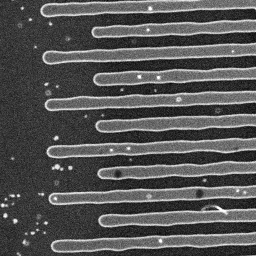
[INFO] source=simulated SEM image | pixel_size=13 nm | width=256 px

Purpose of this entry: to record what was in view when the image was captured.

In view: groups of lines, slits or small figures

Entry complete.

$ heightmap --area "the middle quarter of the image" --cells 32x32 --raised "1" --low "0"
00000000000000000000000000000000
00000000000000000000000000011110
00000000011111111111111111111111
00000001111111111111111111111111
00000000111111111111111111111110
00000000000000000000000000000000
00000000000000000000000000000000
00000000000000000000000000000111
00111111111111111111111111111111
11111111111111111111111111111111
11111111111111111111111111111100
00000000000000000000000000000000
00000000000000000000000000000000
00000000000000000000000000011111
00000000111111111111111111111111
00000000111111111111111111111111
00000000011111110000011110000000
00000000000000000000000000000000
00000000000000000000000000000000
00000000000000000000000011111111
00011111111111111111111111111111
11111111111111111111111111111111
11111111111111111111000000000000
00000000000000000000000000000000
00000000000000000000000000000000
00000000000000000000001111111111
00000000011111111111111111111111
00000000011111111111111111111111
00000000011111110111100000000000
00000000000000000000000000000000
00000000000000000000000000000000
00000000000000000111100011111111